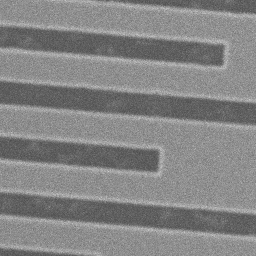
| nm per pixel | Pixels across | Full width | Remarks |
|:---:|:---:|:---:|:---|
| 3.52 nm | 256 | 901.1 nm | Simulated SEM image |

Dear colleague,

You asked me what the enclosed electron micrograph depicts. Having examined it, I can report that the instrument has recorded parallel lines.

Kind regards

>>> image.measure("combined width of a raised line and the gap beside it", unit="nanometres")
195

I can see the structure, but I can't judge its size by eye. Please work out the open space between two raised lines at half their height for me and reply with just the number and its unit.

82 nm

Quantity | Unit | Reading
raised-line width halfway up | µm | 0.113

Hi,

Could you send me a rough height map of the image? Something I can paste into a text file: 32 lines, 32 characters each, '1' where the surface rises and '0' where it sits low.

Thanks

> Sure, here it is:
11111111111111110000000000000000
11111111111111111111111111100000
11111111111111111111111111111111
00000111111111111111111111111111
00000000000000001111111111111111
00000000000000000000000000001111
11111000000000000000000000001111
11111111111111111000000000001111
11111111111111111111111111111111
11111111111111111111111111111111
00000111111111111111111111111111
00000000000000000111111111111111
00000000000000000000000000000111
11111000000000000000000000000000
11111111111111111000000000000000
11111111111111111111111111111000
11111111111111111111111111111111
00000011111111111111111111111111
00000000000000000011111111111111
00000000000000000000111111111111
11111100000000000000111111111111
11111111111111111100111111111111
11111111111111111111111111111111
11111111111111111111111111111111
00000001111111111111111111111111
00000000000000000011111111111111
00000000000000000000000000000011
11111110000000000000000000000000
11111111111111111110000000000000
11111111111111111111111111111100
11111111111111111111111111111111
00000011111111111111111111111111